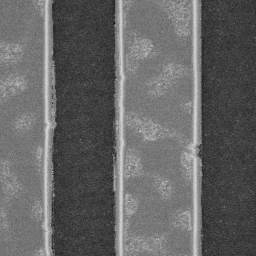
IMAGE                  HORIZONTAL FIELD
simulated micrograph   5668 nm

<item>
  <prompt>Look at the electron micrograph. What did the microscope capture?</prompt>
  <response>one or a few lines or trenches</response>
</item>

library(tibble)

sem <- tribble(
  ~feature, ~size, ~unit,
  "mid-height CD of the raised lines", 1640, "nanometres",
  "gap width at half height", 1660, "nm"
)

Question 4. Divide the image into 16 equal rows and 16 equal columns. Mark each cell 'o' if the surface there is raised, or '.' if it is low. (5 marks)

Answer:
ooo.....oooo....
ooo.....oooo....
ooo.....oooo....
ooo.....oooo....
ooo.....oooo....
ooo.....oooo....
ooo.....oooo....
ooo.....oooo....
ooo.....oooo....
ooo.....oooo....
ooo.....oooo....
ooo.....oooo....
ooo.....oooo....
ooo.....oooo....
ooo.....oooo....
ooo.....oooo....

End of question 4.